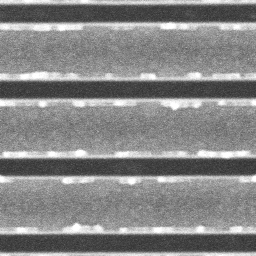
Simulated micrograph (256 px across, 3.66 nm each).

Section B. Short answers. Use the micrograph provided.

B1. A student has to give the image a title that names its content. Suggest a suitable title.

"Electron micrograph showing one or a few lines or trenches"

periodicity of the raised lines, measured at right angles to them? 281 nanometers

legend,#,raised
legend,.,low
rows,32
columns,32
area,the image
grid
................................
................................
................................
################################
################################
################################
################################
################################
################################
################################
................................
................................
................................
################################
################################
################################
################################
################################
################################
################################
................................
................................
################################
################################
################################
################################
################################
################################
################################
................................
................................
................................